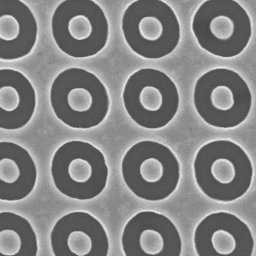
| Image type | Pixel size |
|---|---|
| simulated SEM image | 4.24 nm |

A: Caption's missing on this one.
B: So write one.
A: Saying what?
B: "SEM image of ring-shaped grooves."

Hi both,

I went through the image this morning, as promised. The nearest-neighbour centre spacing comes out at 303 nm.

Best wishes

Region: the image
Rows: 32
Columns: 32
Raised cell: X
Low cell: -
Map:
---XXXXX----XXXX-----XXXX-----XX
----XXX------XXX------XXX------X
XX--XXX--XX--XX---XX--XX---XX--X
XX---X---XX--XX--XXX--XX--XXX--X
XX--XXX--XX--XXX--XX--XX---XX--X
----XXX------XXX------XXX------X
----XXXX----XXXXX----XXXXX----XX
XXXXXXXXXXXXXXXXXXXXXXXXXXXXXXXX
XXXXXXXXXXXXXXXXXXXXXXXXXXX-XXXX
---XXXX-----XXXX-----XXXX-----XX
----XXX------XXX------XXX------X
XX--XX---XX--XX---XX--XX---XX--X
XX--XX--XXX---X---XX--XX--XXX--X
XX--XXX--XX---XX--XX--XX---XX--X
----XXX------XXX------XXX------X
---XXXXX----XXXXX----XXXXX----XX
XXXXXXXXXXXXXXXXXXXXXXXXXXXXXXXX
XXXXXXXXXXXXXXXXXXXXXXXXXXXXXXXX
---XXXX-----XXXX-----XXXX-----XX
----XXX------XXX------XXX------X
XX--XXX--XX--XX---XX--XX---XX--X
XX---X---XX--XX---XX--XX--XXX---
XX--XXX--XX--XXX--XX--XXX--XX--X
----XXX------XXX------XXX------X
---XXXXX----XXXXX----XXXXX----XX
XXXXXXXXXXXXXXXXXXXXXXXXXXXXXXXX
XXXXXXXXXXXXXXXXXX-XXXXXXXXXXXXX
---XXXX-----XXXX-----XXXX-----XX
----XXX------XXX------XXX------X
XX--XX---XX--XX---XX--XX---XX--X
XXX--X---XX---X---XX---X---XX---
XX---XX--XX--XXX--XX---XX--XX--X